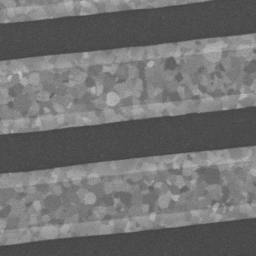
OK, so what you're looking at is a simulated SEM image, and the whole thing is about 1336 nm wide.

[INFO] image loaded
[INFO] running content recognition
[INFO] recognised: one or a few lines or trenches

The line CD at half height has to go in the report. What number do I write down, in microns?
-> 0.301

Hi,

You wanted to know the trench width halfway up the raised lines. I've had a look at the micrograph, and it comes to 277 nm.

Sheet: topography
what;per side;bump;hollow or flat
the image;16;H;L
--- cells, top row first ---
HHHHHLLLLLLLLLLL
LLLLLLLLLLLLLLLL
LLLLLLLLLLLLLLLL
LLLLLLLHHHHHHHHH
HHHHHHHHHHHHHHHH
HHHHHHHHHHHHHHHH
HHHHHHHHHHHHHHLL
HHHHLLLLLLLLLLLL
LLLLLLLLLLLLLLLL
LLLLLLLLLLLLLLLL
LLLLLLLHHHHHHHHH
HHHHHHHHHHHHHHHH
HHHHHHHHHHHHHHHH
HHHHHHHHHHHHHLLL
HHHLLLLLLLLLLLLL
LLLLLLLLLLLLLLLL